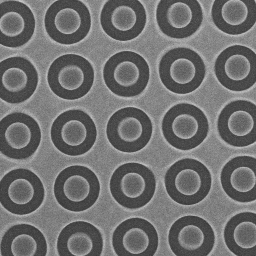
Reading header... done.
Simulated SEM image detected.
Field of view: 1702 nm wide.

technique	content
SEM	an array of small figures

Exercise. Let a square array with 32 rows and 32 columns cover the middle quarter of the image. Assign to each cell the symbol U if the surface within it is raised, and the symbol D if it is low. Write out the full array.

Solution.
DDDDDDDUUUDDDDUUUUDDDUUDDDDUUUUU
UUUUDDDDUDDDDUUUUUDDDDUDDDDUUUUU
UUUUUDDDUUDDDUUUUUDDDUUUDDDUUUUU
UUUUUDDDUUDDDUUUUUDDDUUUDDDUUUUU
UUUUUDDUUUDDDDUUUUDDDUUUDDDDUUUD
UUUUDDDUUUUDDDDDDDDDDUUUUDDDDDDD
DDDDDDDUUUUDDDDDDDDDUUUUUUDDDDDD
DDDDDDUUUUUUUDDDDDDDUUUUUUUUDDUU
DDDDUUUUUUUUUUDDDDUUUUUUUUUUUUUU
UUUUUUUUUUUUUUUUUUUUUUUUUUUUUDDU
UUUUUUUUUUUUUUUUUUUUUUUUUUUDDDDD
UDDDDUUUUUUUUDDDDDDUUUUUUUDDDDDD
DDDDDDUUUUUUDDDDDDDDDUUUUDDDDDDD
DDDDDDDUUUUDDDDDDDDDDDUUDDDDUUUU
DUUUDDDDUUUDDDDUUUUDDDUUDDDUUUUU
UUUUUDDDUUUDDDUUUUUDDDUUDDDUUUUU
UUUUUDDDUUDDDDUUUUUDDDUUDDDUUUUU
UUUUUDDDUUUDDDUUUUUDDDUUUDDDUUUU
UUUUUDDDUUUDDDDUUUDDDDUUUDDDDDDD
UUUUDDDDUUUDDDDDDDDDDUUUUUDDDDDD
DDDDDDDUUUUUDDDDDDDDUUUUUUUDDDDD
DDDDDDDUUUUUUUDDDDDUUUUUUUUUUDDD
DDDDDUUUUUUUUUUUUUUUUUUUUUUUUUUU
UUUUUUUUUUUUUUUUUUUUUUUUUUUUUDDD
UUUUUUUUUUUUUUUUUUUUUUUUUUUUDDDD
UUDDDDUUUUUUUDDDDDDDDUUUUUDDDDDD
DDDDDDDUUUUUUDDDDDDDDDDUUDDDDDUD
DDDDDDDDUUUUDDDDUUDDDDDUDDDDDUUU
DUUUUDDDDUUUDDDUUUUUDDDDUDDDUUUU
UUUUUUDDDUUDDDDUUUUUDDDUUDDDUUUU
UUUUUUDDDUUDDDDUUUUUDDDUUDDDUUUU
UUUUUUDDDUUDDDDUUUUUDDDUUUDDDUUU